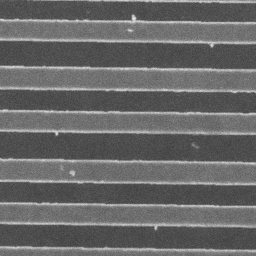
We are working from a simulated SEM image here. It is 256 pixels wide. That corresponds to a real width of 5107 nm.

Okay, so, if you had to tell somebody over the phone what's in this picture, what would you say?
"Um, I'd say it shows lines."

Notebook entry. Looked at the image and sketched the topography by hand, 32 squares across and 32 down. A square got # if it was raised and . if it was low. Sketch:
................................
................................
#.#.............................
################################
################################
................................
................................
................................
##########......................
################################
################################
.............................#..
................................
................................
################################
################################
..............#.################
................................
................................
................................
################################
################################
################################
................................
................................
#######.........................
################################
################################
................................
................................
................................
################################